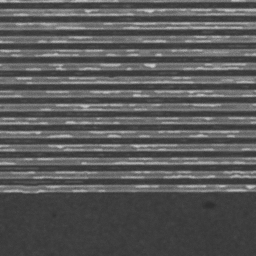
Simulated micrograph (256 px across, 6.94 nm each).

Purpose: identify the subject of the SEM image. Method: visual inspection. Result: parallel lines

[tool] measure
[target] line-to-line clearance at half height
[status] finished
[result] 0.0495 micrometres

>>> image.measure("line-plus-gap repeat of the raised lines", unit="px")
13.6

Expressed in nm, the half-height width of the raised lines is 43.4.